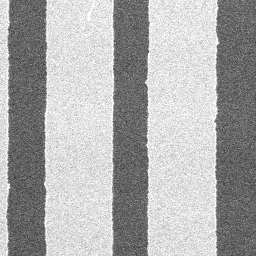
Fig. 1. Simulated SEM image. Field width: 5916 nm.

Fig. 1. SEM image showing one or a few lines or trenches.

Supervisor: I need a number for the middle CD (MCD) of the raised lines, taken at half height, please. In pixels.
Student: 67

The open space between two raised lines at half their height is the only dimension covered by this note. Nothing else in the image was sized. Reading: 861 nm